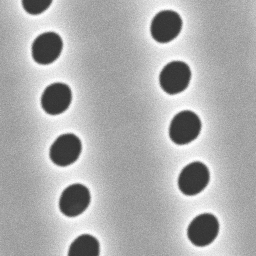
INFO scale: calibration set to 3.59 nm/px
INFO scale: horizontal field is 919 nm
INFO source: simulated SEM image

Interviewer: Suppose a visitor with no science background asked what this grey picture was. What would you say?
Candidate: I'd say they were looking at a regular array of holes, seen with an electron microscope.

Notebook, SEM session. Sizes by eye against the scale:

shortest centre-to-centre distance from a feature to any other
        184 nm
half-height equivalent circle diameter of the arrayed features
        117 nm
